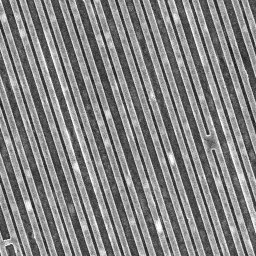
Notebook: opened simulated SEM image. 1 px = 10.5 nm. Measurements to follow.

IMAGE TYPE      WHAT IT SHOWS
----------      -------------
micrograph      parallel lines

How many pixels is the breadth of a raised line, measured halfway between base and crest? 5.96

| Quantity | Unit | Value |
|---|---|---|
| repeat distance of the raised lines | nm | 123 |